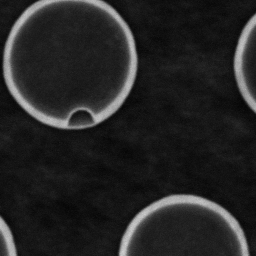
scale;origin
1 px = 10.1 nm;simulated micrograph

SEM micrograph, raised bodies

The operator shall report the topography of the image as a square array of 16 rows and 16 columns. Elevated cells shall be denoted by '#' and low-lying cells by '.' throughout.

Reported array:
..#####.........
.#######........
.#######.......#
########.......#
########.......#
.#######.......#
.######.........
...#............
................
................
................
................
...........#....
.........#####..
........#######.
#.......#######.